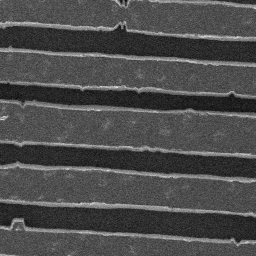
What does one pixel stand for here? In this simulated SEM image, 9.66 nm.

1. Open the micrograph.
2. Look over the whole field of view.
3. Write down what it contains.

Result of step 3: parallel lines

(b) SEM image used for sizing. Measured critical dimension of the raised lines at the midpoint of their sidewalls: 341 nanometers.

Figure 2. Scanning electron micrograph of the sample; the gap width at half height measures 0.227 um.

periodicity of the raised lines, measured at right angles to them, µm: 0.561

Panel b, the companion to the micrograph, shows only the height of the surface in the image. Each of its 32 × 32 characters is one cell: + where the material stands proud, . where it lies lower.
+++++++++++++++++++++++++++++...
++++++++++++++++++++++++++++++++
++++++++++++++++++++++++++++++++
..........++++..++++++++++++++++
.......................+++++++++
................................
+++++...........................
+++++++++++++++++++++++.........
++++++++++++++++++++++++++++++++
++++++++++++++++++++++++++++++++
.....+++++++++++++++++++++++++++
.....................+++++++++++
................................
+++++++++.+++...................
++++++++++++++++++++++++++++++++
++++++++++++++++++++++++++++++++
++++++++++++++++++++++++++++++++
++++++++++++++++++++++++++++++++
..............+.++++++++++++++++
...............................+
................................
+++++++++++++++++...............
+++++++++++++++++++++++++++++++.
++++++++++++++++++++++++++++++++
++++++++++++++++++++++++++++++++
......++++++++++++++++++++++++++
...........................+++++
..+.............................
++++............................
+++++++++++++++++++.............
++++++++++++++++++++++++++++++++
++++++++++++++++++++++++++++++++